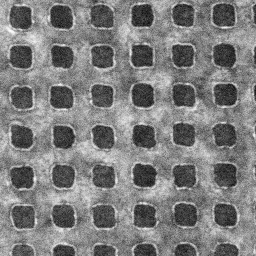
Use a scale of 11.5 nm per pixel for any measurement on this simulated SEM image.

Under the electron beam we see a regular array of raised bodies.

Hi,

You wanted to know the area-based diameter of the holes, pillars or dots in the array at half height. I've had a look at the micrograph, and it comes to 0.302 um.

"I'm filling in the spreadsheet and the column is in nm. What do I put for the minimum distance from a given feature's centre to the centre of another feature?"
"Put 455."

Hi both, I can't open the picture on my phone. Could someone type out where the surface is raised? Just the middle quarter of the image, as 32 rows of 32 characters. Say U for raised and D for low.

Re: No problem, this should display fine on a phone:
UUDDDDDUUUUUDDDDDUUUUUDDDDDDUUUU
DDDDDDDDDDDDDDDDDDDDDDDDDDDDDDDD
DDDDDDDDDDDDDDDDDDDDDDDDDDDDDDDD
DDDDDDDDDDDDDDDDDDDDDDDDDDDDDDDD
DDDDDDDDDDDDDDDDDDDUDDDDDDDDDDDD
UDDDDDDUUUUUDDDDDUUUUUDDDDDUUUUU
UUDDDDDUUUUUUDDDDUUUUUDDDDDUUUUU
UUDDDDDUUUUUUDDDDUUUUUDDDDDUUUUU
UUUDDDDUUUUUDDDDDUUUUUUDDDDUUUUU
UUDDDDDUUUUUDDDDDUUUUUUDDDDUUUUU
UUDDDDDDUUUUDDDDDDUUUUDDDDDDUUUU
DDDDDDDDDDDDDDDDDDDDDDDDDDDDDDDD
DDDDDDDDDDDDDDDDDDDDDDDDDDDDDDDD
DDDDDDDDDDDDDDDDDDDDDDDDDDDDDDDD
DDDDDDDDDDDDDDDDDDDDDDDDDDDDDDDD
UUDDDDDDUUUDDDDDDDUUUUDDDDDUUUUU
UUDDDDDUUUUUUDDDDUUUUUUDDDDUUUUU
UUUDDDDUUUUUUDDDDUUUUUUDDDDUUUUU
UUUDDDDUUUUUUDDDDUUUUUUDDDDUUUUU
UUUDDDDUUUUUUDDDDUUUUUUDDDDUUUUU
UUDDDDDDUUUUDDDDDDUUUUUDDDDDDUUU
DDDDDDDDDDDDDDDDDDDDDDDDDDDDDDDD
DDDDDDDDDDDDDDDDDDDDDDDDDDDDDDDD
DDDDDDDDDDDDDDDDDDDDDDDDDDDDDDDD
DDDDDDDDDDDDDDDDDDDDDDDDDDDDDDDD
UUDDDDDDUUUUDDDDDUUUUUDDDDDUUUUU
UUUDDDDUUUUUUDDDDUUUUUUDDDDUUUUU
UUUDDDDUUUUUUDDDDUUUUUUDDDDUUUUU
UUUDDDDUUUUUUDDDDUUUUUUDDDDUUUUU
UUUDDDDUUUUUUDDDDUUUUUUDDDDUUUUU
UUDDDDDDUUUUUDDDDDUUUUUDDDDDUUUU
DDDDDDDDDDDDDDDDDDDDDDDDDDDDDDDD